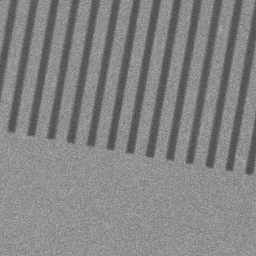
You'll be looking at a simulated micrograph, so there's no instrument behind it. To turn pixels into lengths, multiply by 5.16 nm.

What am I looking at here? parallel lines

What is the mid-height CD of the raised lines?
61.6 nm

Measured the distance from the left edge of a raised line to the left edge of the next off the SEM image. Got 0.104 µm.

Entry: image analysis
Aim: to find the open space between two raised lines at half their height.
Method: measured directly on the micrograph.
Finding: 45.8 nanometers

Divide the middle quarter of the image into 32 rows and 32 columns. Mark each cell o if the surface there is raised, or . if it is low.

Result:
.ooo..ooo..ooo..ooo..ooo...ooo..
.ooo..ooo..ooo..ooo..ooo..ooo..o
.ooo..ooo..ooo..ooo..ooo..ooo..o
.ooo..ooo..ooo..ooo..ooo..ooo..o
ooo..ooo...oo...oo...ooo..ooo..o
ooo..ooo..ooo..ooo...oo...ooo..o
ooo..ooo..ooo..ooo...oo...oo...o
ooo..ooo..ooo..ooo..ooo..ooo..oo
ooo..ooo..ooo..ooo..ooo..ooo..oo
oo...ooo..ooo..ooo..ooo..ooo..oo
oo..ooo..ooo..ooo...oo...ooo..oo
oo..ooo..ooo..ooo..ooo...ooo..oo
oo..ooo..ooo..ooo..ooo..ooo...oo
o...ooo..ooo..ooo..ooo..ooo..ooo
o...ooo..ooo..ooo..ooo..ooo..ooo
o...oo...oo...ooo..ooo..ooo..ooo
o..ooo..ooo..ooo...oo...ooo..ooo
o..ooo..ooo..ooo...oo...oo...ooo
o..ooo..ooo..ooo..ooo..ooo..ooo.
o..ooo..ooo..ooo..ooo..ooo..ooo.
oooooo..ooo..ooo..ooo..ooo..ooo.
ooooooooooo.ooo...oo...ooo..ooo.
oooooooooooooooooooo...ooo..ooo.
ooooooooooooooooooooo.ooo...oo..
oooooooooooooooooooooooooooooo..
oooooooooooooooooooooooooooooooo
oooooooooooooooooooooooooooooooo
oooooooooooooooooooooooooooooooo
oooooooooooooooooooooooooooooooo
oooooooooooooooooooooooooooooooo
oooooooooooooooooooooooooooooooo
oooooooooooooooooooooooooooooooo